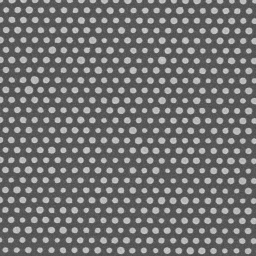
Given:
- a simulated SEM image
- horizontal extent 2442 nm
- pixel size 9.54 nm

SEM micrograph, a regular array of raised bodies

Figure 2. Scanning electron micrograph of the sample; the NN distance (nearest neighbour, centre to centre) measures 108 nanometers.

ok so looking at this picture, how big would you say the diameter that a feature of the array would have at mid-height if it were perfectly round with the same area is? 55.9 nanometers